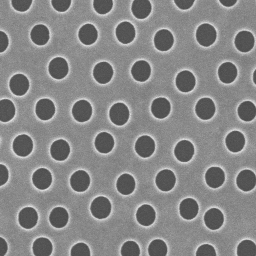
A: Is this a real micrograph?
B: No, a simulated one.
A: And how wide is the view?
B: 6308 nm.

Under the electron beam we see a regular array of holes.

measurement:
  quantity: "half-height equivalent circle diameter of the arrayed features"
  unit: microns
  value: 0.522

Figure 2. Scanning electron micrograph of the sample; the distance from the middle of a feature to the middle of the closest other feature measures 878 nanometres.